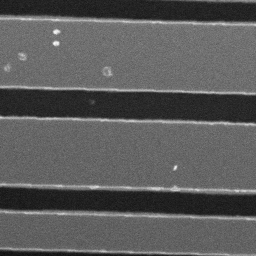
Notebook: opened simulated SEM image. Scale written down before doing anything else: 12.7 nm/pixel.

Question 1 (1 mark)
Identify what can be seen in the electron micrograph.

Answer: lines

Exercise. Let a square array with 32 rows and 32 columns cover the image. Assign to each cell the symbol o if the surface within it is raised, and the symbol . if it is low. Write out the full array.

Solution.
................................
................................
ooooooooo.......................
oooooooooooooooooooooooooooooooo
oooooooooooooooooooooooooooooooo
oooooooooooooooooooooooooooooooo
oooooooooooooooooooooooooooooooo
oooooooooooooooooooooooooooooooo
oooooooooooooooooooooooooooooooo
oooooooooooooooooooooooooooooooo
oooooooooooooooooooooooooooooooo
.........................ooooooo
................................
................................
................................
ooooooooooooooooooooooooooooo...
oooooooooooooooooooooooooooooooo
oooooooooooooooooooooooooooooooo
oooooooooooooooooooooooooooooooo
oooooooooooooooooooooooooooooooo
oooooooooooooooooooooooooooooooo
oooooooooooooooooooooooooooooooo
oooooooooooooooooooooooooooooooo
..................oooooooooooooo
................................
................................
oo..............................
oooooooooooooooooooooooooooooooo
oooooooooooooooooooooooooooooooo
oooooooooooooooooooooooooooooooo
oooooooooooooooooooooooooooooooo
................oooooooooooooooo